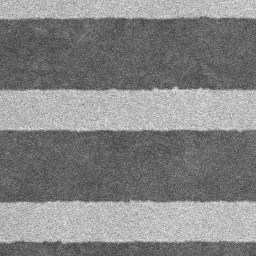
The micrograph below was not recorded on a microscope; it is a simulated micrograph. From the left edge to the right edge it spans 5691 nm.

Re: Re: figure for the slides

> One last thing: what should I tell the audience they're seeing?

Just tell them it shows one or a few lines or trenches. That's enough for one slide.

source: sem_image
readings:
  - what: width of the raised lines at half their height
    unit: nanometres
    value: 875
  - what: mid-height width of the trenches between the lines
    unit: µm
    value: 1.6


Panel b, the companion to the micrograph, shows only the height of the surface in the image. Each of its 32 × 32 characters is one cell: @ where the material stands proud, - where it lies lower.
@@@@@@@@@@@@@@@@@@@@@@@@@@@@@@@@
@@@@@@@@@@@@@@@@@@@@@@@@@@@@@@@@
--------------------------------
--------------------------------
--------------------------------
--------------------------------
--------------------------------
--------------------------------
--------------------------------
--------------------------------
--------------------------------
@@@@@@@@@@@@@@@@@@@@@@@@@@@@@@@@
@@@@@@@@@@@@@@@@@@@@@@@@@@@@@@@@
@@@@@@@@@@@@@@@@@@@@@@@@@@@@@@@@
@@@@@@@@@@@@@@@@@@@@@@@@@@@@@@@@
@@@@@@@@@@@@@@@@@@@@@@@@@@@@@@@@
--------------------------------
--------------------------------
--------------------------------
--------------------------------
--------------------------------
--------------------------------
--------------------------------
--------------------------------
--------------------------------
@@@@@@@@@@@@@@@@@@@@@@@@@@@@@@@@
@@@@@@@@@@@@@@@@@@@@@@@@@@@@@@@@
@@@@@@@@@@@@@@@@@@@@@@@@@@@@@@@@
@@@@@@@@@@@@@@@@@@@@@@@@@@@@@@@@
@@@@@@@@@@@@@@@@@@@@@@@@@@@@@@@@
--------------------------------
--------------------------------